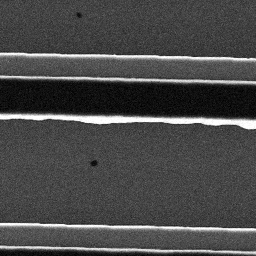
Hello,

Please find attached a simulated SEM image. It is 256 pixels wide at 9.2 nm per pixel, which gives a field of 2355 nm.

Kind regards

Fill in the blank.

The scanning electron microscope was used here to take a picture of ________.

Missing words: lines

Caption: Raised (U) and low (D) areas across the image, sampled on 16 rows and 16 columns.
DDDDDDDDDDDDDDDD
DDDDDDDDDDDDDDDD
DDDDDDDDDDDDDDDD
UUUUUUUUDDDDDDDD
UUUUUUUUUUUUUUUU
UUUUUUUUUUUUUUUU
UUUUUUUUUUUUUUUU
DDDDDDDDDDUUUUUU
DDDDDDDDDDDDDDDD
DDDDDDDDDDDDDDDD
DDDDDDDDDDDDDDDD
DDDDDDDDDDDDDDDD
DDDDDDDDDDDDDDDD
DDDDDDDDDDDDDDDD
UUUUUUUUUUUUUUUU
UUUUUUUUUUUUUUUU